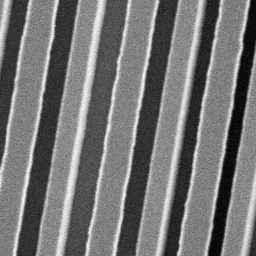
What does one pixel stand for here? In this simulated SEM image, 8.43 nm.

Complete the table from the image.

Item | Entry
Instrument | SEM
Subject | lines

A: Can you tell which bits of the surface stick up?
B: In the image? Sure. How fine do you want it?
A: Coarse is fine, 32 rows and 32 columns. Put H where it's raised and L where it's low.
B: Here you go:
HLLLHHHLLLHHHLLLHHHHLLHHHHLHHHHL
HLLHHHHLLLHHHLLLHHHHLLHHHLLHHHHL
HLLHHHHLLHHHHLLLHHHLLLHHHLLHHHHL
HLLHHHHLLHHHLLLLHHHLLLHHHLLHHHHL
HLLHHHHLLHHHLLLHHHHLLLHHHLLHHHLL
LLLHHHLLLHHHLLLHHHHLLHHHHLLHHHLL
LLHHHHLLLHHHLLLHHHHLLHHHHLHHHHLL
LLHHHHLLLHHHLLLHHHHLLHHHLLHHHHLL
LLHHHHLLHHHHLLLHHHLLLHHHLLHHHHLL
LLHHHHLLHHHHLLLHHHLLLHHHLLHHHHLH
LLHHHHLLHHHLLLHHHHLLLHHHLLHHHHLH
LLHHHLLLHHHLLLHHHHLLHHHHLLHHHLLH
LHHHHLLLHHHLLLHHHHLLHHHHLHHHHLLH
LHHHHLLLHHHLLLHHHHLLHHHLLHHHHLLH
LHHHHLLHHHHLLLHHHLLLHHHLLHHHHLLH
LHHHHLLHHHHLLHHHHLLLHHHLLHHHHLHH
LHHHHLLHHHLLLHHHHLLLHHHLLHHHLLHH
LHHHLLLHHHLLLHHHHLLHHHHLLHHHLLHH
LHHHLLLHHHLLLHHHHLLHHHHLLHHHLLHH
HHHHLLLHHHLLLHHHHLLHHHLLHHHHLLHH
HHHHLLHHHHLLLHHHLLLHHHLLHHHHLLHH
HHHHLLHHHLLLLHHHLLLHHHLLHHHHLHHH
HHHHLLHHHLLLHHHHLLLHHHLLHHHLLHHH
HHHLLLHHHLLLHHHHLLHHHHLLHHHLLHHH
HHHLLLHHHLLLHHHHLLHHHLLLHHHLLHHH
HHHLLLHHHLLLHHHLLLHHHLLHHHHLLHHH
HHHLLHHHHLLLHHHLLLHHHLLHHHHLHHHH
HHHLLHHHLLLHHHHLLLHHHLLHHHHLHHHH
HHHLLHHHLLLHHHHLLLHHHLLHHHLLHHHL
HHLLLHHHLLLHHHHLLHHHHLLHHHLLHHHL
HHLLLHHHLLLHHHHLLHHHLLHHHHLLHHHL
HHLLLHHHLLLHHHLLLHHHLLHHHHLLHHHL